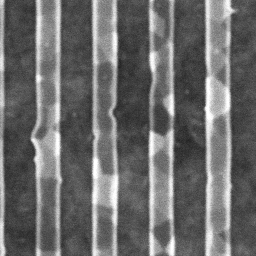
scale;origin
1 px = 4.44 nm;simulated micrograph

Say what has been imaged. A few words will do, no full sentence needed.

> parallel lines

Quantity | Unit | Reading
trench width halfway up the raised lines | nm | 159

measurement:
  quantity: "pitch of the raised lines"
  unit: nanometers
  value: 252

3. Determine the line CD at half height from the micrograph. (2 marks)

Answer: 91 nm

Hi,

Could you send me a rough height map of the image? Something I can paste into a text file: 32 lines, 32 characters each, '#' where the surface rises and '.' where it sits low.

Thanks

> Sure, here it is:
.....##.....##.....###....###...
.....##.....##.....###....###...
.....##.....##.....###....###...
.....##.....##.....###....###...
.....##.....##.....##.....###...
.....##.....##.....##.....###...
.....##.....##.....##.....###...
.....##.....##.....##.....###...
.....##.....##.....##.....##....
.....##.....##.....##.....##....
.....##.....##.....##.....##....
.....##.....##.....##.....##....
.....##.....##.....##.....##....
.....##.....##.....###....##....
.....##.....##.....###....##....
.....##.....##.....##.....###...
....###.....##.....##.....###...
....###.....##.....##.....###...
.....##.....##.....##.....###...
.....##.....##.....##.....###...
.....##.....##.....##.....###...
.....##.....###....##.....###...
.....##.....###....##.....###...
.....##.....###....##.....###...
.....##.....##.....##.....###...
.....##.....##.....##.....###...
.....##.....##.....##.....###...
.....##.....##.....##.....###...
.....##.....##.....###....###...
.....##.....##.....###....###...
.....##.....##.....###....###...
.....##.....##.....###....###...